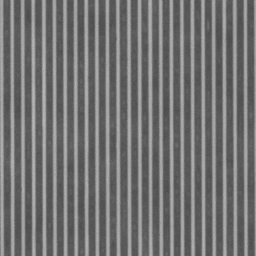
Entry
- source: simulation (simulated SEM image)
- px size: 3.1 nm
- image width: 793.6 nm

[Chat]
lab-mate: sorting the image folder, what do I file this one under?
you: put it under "parallel lines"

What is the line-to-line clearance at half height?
0.0248 microns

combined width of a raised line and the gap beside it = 0.0328 microns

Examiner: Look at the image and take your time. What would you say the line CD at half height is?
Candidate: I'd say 9.3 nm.